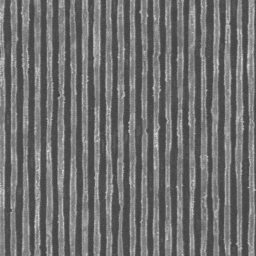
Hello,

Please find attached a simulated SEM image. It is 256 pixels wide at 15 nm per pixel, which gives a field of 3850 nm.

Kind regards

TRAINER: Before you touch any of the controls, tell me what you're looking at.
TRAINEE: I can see parallel lines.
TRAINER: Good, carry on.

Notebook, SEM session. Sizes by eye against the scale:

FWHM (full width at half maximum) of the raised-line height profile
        80.9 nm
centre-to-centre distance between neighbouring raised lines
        179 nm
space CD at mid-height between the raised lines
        107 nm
